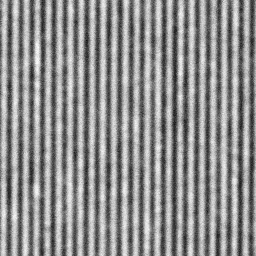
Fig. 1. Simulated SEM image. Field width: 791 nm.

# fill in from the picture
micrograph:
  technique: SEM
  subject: parallel lines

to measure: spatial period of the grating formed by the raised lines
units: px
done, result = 11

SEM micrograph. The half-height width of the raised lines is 13.9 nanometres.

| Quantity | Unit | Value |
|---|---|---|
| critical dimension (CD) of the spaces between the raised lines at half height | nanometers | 19.3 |